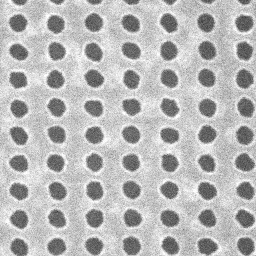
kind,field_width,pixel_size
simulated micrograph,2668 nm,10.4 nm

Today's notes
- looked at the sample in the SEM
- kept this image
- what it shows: a regular array of holes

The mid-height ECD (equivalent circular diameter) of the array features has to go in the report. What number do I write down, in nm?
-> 210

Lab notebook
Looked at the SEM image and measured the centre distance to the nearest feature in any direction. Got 27.5 pixels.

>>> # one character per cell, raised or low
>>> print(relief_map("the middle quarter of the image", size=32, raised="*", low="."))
********************************
******..*******...*******..*****
*****.....*****....*****....****
*****.....*****....*****.....***
*****.....****.....*****.....***
******....*****....******....***
*****************.**************
********************************
*****************.*******.******
*****.....****.....*****....****
.****.....****.....*****.....***
.****.....****......****.....***
******....*****....******....***
********.*****************.*****
********************************
*******..******...**************
*****.....****.....*****.....***
.****.....****.....*****.....***
.****.....*****....*****.....***
******...******....******....***
********************************
********************************
******...*******..*******..*****
*****.....****.....*****.....***
*****.....****.....*****.....***
*****.....*****....*****.....***
******...******....******...****
********************************
********************************
******...******...*******...****
*****.....****.....*****.....***
.****.....****......****.....***